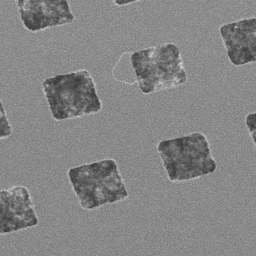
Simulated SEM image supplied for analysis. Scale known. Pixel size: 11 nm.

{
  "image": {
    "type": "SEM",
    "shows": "holes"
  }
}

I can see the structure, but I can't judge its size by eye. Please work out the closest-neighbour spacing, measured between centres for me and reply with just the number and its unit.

1000 nm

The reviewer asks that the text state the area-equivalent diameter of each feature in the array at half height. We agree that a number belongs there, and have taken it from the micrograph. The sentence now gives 548 nanometers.